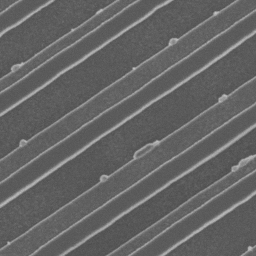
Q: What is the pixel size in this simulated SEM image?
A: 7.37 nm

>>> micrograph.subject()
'lines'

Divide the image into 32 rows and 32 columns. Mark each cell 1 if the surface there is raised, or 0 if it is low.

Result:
11111100000000111111100000000111
11110000000011111110000000011111
11100000000111111100000000111111
10000000001111110000000011111111
00000000111111100000000111111110
00000011111110000000011111111100
00000111111100000000111111110000
00001111110000000011111111100000
00111111100000000111111111000000
01111110000000001111111100000000
11111100000000111111111000000001
11110000000001111111100000000111
11100000000111111110000000011111
10000000001111111100000000111111
00000000111111111000000001111111
00000001111111100000000111111111
00000111111111000000001111111110
00001111111100000000111111111000
00111111111000000011111111110000
01111111100000000111111111000001
11111111000000001111111110000011
11111100000000111111111000000111
11111000000001111111110000011111
11100000000111111111000000111111
11000000001111111110000011111110
00000000111111111000000111111100
00000001111111110000011111110000
00000111111111000000111111100000
00001111111110000001111110000000
00011111111000000111111100000000
01111111110000001111110000000000
11111111000000111111100000000001